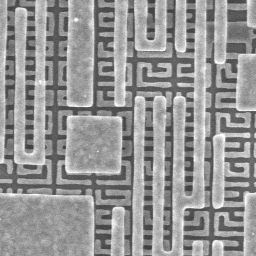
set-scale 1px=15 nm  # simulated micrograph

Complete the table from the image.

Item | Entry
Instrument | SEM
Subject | wiring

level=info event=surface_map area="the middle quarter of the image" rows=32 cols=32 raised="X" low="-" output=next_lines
-XXXXXX------XX-----------------
-XXXXXX------XX-----------------
-XXXXXX------XX-----------------
-XXXXXX------XX-----------------
-XXXXXX------XX-----------------
-XXXXXX------XX-----------------
-XXXXXX------XX-----------------
-XXXXXX------XX-----------------
-XXXXXX------XX---XX---XX--XXX--
-XXXXXX------XX---XX---XX--XXX--
-XXXXXX------XX---XX---XX--XXX--
------------------XX--XXX--XXX--
------------------XX--XXX--XXX--
-XXXXXXXXXXXXX----XX--XXX--XXX--
-XXXXXXXXXXXXX----XX--XXX--XXX--
-XXXXXXXXXXXXX----XX---XX--XXX--
-XXXXXXXXXXXXX----XX---XX--XXX--
-XXXXXXXXXXXXX----XX---XX--XXX--
-XXXXXXXXXXXXX----XX---XX--XXX--
-XXXXXXXXXXXXX----XX---XX--XXX--
-XXXXXXXXXXXXX----XX---XX--XXX--
-XXXXXXXXXXXXX----XX---XX--XXX--
-XXXXXXXXXXXXX----XX---XX--XXX--
-XXXXXXXXXXXXX----XX---XX--XXX--
-XXXXXXXXXXXXX----XX---XX--XXX--
-XXXXXXXXXXXXX----XX---XX--XXX--
-XXXXXXXXXXXXX----XX--XXX--XXX--
------------------XX--XXX--XXX--
------------------XX--XXX--XXX--
------------------XX--XXX--XXX--
------------------XX--XXX--XXX--
-----------------XXX--XXX--XXX--